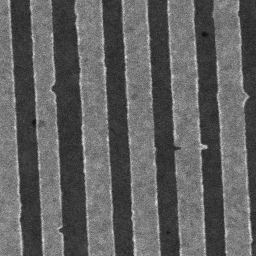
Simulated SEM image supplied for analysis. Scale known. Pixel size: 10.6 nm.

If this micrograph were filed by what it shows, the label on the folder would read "parallel lines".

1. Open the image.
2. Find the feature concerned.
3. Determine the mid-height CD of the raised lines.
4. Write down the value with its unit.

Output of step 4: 0.266 micrometres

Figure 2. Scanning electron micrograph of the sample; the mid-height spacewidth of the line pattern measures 20.1 px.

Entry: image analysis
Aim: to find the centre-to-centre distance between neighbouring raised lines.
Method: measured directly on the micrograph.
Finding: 46.4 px